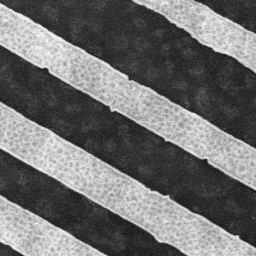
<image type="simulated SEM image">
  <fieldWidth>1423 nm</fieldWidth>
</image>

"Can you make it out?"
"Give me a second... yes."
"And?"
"one or a few lines or trenches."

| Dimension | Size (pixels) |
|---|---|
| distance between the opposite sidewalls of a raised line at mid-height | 34.6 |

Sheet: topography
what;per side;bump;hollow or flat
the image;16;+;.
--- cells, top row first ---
.........++++...
++.........++++.
++++........++++
.+++++.........+
...++++.........
.....++++.......
.......++++.....
++......+++++...
++++......++++..
.++++.......++++
..+++++.......++
....+++++......+
......+++++.....
++......++++....
++++.....+++++..
.+++++.....+++++